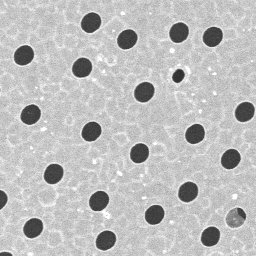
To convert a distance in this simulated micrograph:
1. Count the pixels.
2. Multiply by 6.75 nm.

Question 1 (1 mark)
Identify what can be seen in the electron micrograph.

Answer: a regular array of holes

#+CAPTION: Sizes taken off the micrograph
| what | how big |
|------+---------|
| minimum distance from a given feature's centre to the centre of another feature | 0.292 µm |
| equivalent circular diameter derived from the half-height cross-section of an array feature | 0.137 micrometres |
